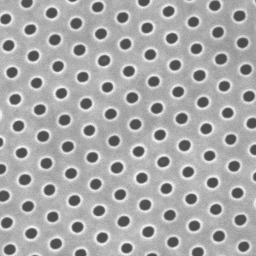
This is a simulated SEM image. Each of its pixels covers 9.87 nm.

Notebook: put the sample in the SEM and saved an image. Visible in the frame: a regular array of holes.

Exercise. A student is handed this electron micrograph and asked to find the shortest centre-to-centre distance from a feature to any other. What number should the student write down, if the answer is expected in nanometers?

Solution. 263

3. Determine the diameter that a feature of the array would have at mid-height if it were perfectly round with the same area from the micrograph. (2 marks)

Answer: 113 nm